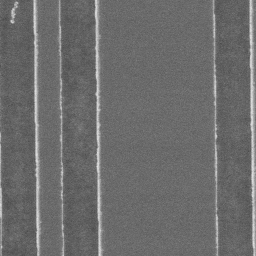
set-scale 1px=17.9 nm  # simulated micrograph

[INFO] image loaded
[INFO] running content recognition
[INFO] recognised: lines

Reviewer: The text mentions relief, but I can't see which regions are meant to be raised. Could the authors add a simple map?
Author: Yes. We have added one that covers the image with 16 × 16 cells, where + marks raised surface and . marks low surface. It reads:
..++..+++++++...
..++..+++++++...
..++..+++++++...
..++..+++++++...
..++..+++++++...
..++..+++++++...
..++..+++++++...
..++..+++++++...
..++..++++++++..
..++..++++++++..
..++..++++++++..
..++..++++++++..
..++..++++++++..
..++..++++++++..
..++..++++++++..
..++..++++++++..